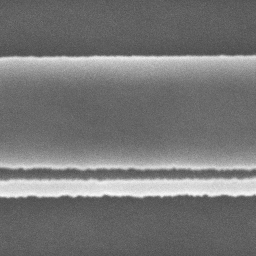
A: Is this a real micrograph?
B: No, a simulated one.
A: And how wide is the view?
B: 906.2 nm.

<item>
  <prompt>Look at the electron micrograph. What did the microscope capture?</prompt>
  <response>lines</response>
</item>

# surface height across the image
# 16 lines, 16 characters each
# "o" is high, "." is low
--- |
................
................
................
.............o.o
oooooooooooooooo
oooooooooooooooo
oooooooooooooooo
oooooooooooooooo
oooooooooooooooo
oooooooooooooooo
oooooooooooooooo
oooooooooooooooo
................
................
................
................